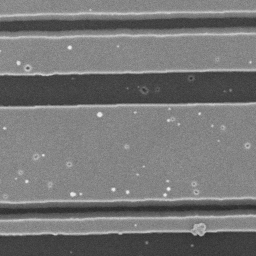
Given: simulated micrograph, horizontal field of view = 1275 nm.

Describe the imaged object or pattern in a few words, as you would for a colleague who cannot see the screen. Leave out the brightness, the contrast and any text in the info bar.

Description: lines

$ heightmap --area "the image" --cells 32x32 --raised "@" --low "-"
@@@@@@@@@@@@@@@@@@@@@@@@@@@@@@@@
@@@@@@@@@@@@@@@@@@@@@@@@@@@@@@@@
--------------------------------
--------------------------------
@@@@@@@@@@@@@@@@@@@@@@@@@@@@@@@@
@@@@@@@@@@@@@@@@@@@@@@@@@@@@@@@@
@@@@@@@@@@@@@@@@@@@@@@@@@@@@@@@@
@@@@@@@@@@@@@@@@@@@@@@@@@@@@@@@@
@@@@@@@@@@@@@@@@@@@@@@@@@@@@@@@@
--------------------------------
--------------------------------
--------------------------------
--------------------------------
@@@@@@@@@@@@@@@@@@@@@@@@@@@@@@@@
@@@@@@@@@@@@@@@@@@@@@@@@@@@@@@@@
@@@@@@@@@@@@@@@@@@@@@@@@@@@@@@@@
@@@@@@@@@@@@@@@@@@@@@@@@@@@@@@@@
@@@@@@@@@@@@@@@@@@@@@@@@@@@@@@@@
@@@@@@@@@@@@@@@@@@@@@@@@@@@@@@@@
@@@@@@@@@@@@@@@@@@@@@@@@@@@@@@@@
@@@@@@@@@@@@@@@@@@@@@@@@@@@@@@@@
@@@@@@@@@@@@@@@@@@@@@@@@@@@@@@@@
@@@@@@@@@@@@@@@@@@@@@@@@@@@@@@@@
@@@@@@@@@@@@@@@@@@@@@@@@@@@@@@@@
@@@@@@@@@@@@@@@@@@@@@@@@@@@@@@@@
@@@@@---------------------------
--------------------------------
@@@@@@@@@@@@@@@@@@@@@@@@@@@@@@@@
@@@@@@@@@@@@@@@@@@@@@@@@@@@@@@@@
--------------------------------
--------------------------------
--------------------------------